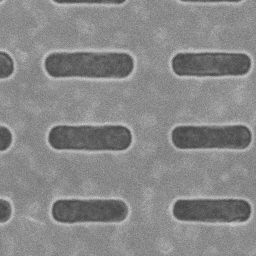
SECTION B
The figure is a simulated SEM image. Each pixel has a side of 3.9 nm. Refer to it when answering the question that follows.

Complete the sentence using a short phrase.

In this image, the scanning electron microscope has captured holes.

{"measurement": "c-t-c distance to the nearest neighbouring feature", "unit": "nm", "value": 285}